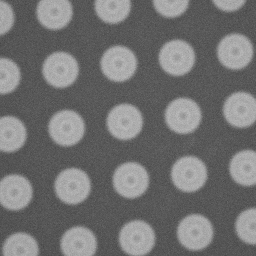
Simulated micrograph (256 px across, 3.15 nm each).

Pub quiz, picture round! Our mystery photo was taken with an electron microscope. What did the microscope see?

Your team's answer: an array of small figures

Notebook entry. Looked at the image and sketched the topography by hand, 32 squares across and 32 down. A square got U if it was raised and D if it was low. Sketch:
UDDDDUUUUDDDUUUUDDDUUUUUDDDUUUDD
UUDDDUUUUDDDUUUUDDDDUUUDDDDDDDDD
UUDDDUUUUDDDDUUDDDDDDDDDDDDDDDDD
UDDDDDUUDDDDDDDDDDDDDDDDDDDDDDDD
DDDDDDDDDDDDDDDDDDDDDDDDDDDDUUDD
DDDDDDDDDDDDDDDDDDDDDUUDDDDUUUUD
DDDDDDDDDDDDDUUUDDDDUUUUDDDUUUUU
UDDDDDUUUDDDDUUUUDDDUUUUDDDUUUUD
UUDDDUUUUUDDDUUUUDDDUUUUDDDDDUDD
UUDDDDUUUUDDDUUUDDDDDDDDDDDDDDDD
UUDDDDUUUDDDDDDDDDDDDDDDDDDDDDDD
UDDDDDDDDDDDDDDDDDDDDDDDDDDDDDDD
DDDDDDDDDDDDDDDDDDDDDDUUDDDDUUUU
DDDDDDDDDDDDDDUUUDDDDUUUUDDDUUUU
DDDDDDDUUUDDDDUUUUDDDUUUUDDDUUUU
UUUDDDUUUUDDDUUUUUDDDUUUUDDDDUUD
UUUDDDUUUUDDDDUUUDDDDDUUDDDDDDDD
UUUDDDDUUUDDDDDDDDDDDDDDDDDDDDDD
UUDDDDDDDDDDDDDDDDDDDDDDDDDDDDDD
DDDDDDDDDDDDDDDDDDDDDDDDDDDDDUUU
DDDDDDDDDDDDDDDDUDDDDDUUUDDDDUUU
DDDDDDDDUUDDDDUUUUDDDUUUUUDDDUUU
UUUDDDDUUUUDDDUUUUUDDDUUUUDDDUUU
UUUUDDDUUUUDDDUUUUDDDDUUUDDDDDDD
UUUUDDDUUUUDDDDUUDDDDDDDDDDDDDDD
UUUDDDDDDDDDDDDDDDDDDDDDDDDDDDDD
DDDDDDDDDDDDDDDDDDDDDDDDDDDDDDUU
DDDDDDDDDDDDDDDDDDDDDDDUUUDDDDUU
DDDDDDDDDUUDDDDUUUUDDDUUUUUDDUUU
DUUUDDDDUUUUDDDUUUUDDDUUUUUDDDUU
DUUUUDDDUUUUDDDUUUUDDDDUUUDDDDDD
UUUUUDDDUUUUDDDDUUUDDDDDDDDDDDDD